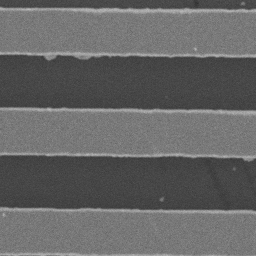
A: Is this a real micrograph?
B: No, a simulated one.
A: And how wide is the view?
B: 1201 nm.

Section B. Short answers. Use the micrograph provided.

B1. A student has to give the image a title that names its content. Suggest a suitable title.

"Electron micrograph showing lines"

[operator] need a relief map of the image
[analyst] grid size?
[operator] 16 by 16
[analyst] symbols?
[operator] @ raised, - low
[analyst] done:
----------------
@@@@@@@@@@@@@@@@
@@@@@@@@@@@@@@@@
----------@-@@@@
----------------
----------------
----------------
@@@@@@@@@@@@@@@@
@@@@@@@@@@@@@@@@
@@@@@@@@@@@@@@@@
----------------
----------------
----------------
@@@@@@@@@@@@@@@@
@@@@@@@@@@@@@@@@
@@@@@@@@@@@@@@@@